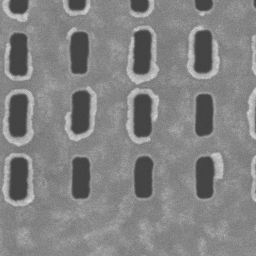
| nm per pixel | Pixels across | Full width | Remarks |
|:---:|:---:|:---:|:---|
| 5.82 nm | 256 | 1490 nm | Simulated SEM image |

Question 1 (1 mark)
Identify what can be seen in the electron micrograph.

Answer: a regular array of holes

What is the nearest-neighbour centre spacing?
0.356 microns